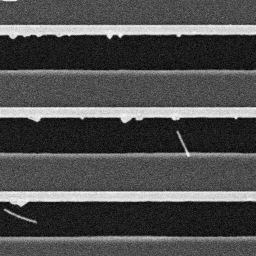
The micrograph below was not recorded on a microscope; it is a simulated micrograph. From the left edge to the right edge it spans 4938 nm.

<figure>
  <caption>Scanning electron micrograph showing lines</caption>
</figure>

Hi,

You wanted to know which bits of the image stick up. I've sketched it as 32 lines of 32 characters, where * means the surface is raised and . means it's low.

********************************
********************************
********************************
********************************
.*.....*.....*..................
................................
................................
................................
................................
********************************
********************************
********************************
********************************
********************************
********************************
................................
................................
................................
................................
********************************
********************************
********************************
********************************
********************************
********************************
..*.............................
................................
................................
................................
................................
********************************
********************************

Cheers